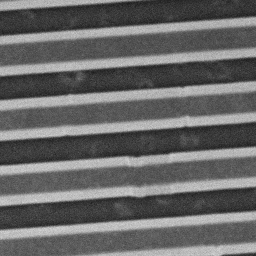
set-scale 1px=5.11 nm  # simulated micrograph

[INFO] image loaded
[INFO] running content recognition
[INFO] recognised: one or a few lines or trenches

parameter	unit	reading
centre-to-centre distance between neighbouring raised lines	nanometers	331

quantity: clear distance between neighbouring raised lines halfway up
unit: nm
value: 168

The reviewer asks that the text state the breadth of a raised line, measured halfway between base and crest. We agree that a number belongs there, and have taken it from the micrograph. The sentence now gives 164 nm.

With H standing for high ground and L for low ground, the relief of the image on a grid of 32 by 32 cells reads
HHHHLLLLLLLLLLLLLLLLLLLLLLLLLLLL
LLLLLLLLLLLLLLLLLLLLLLLLLLLLLLLL
LLLLLLLLLLLLLLLLLLLLLLLLLLLLLLLL
LLLLLLLLLLLLLLLLLLLLHHHHHHHHHHHH
LLLLLLLHHHHHHHHHHHHHHHHHHHHHHHHH
HHHHHHHHHHHHHHHHHHHHHHHHHHHHHHHH
HHHHHHHHHHHHHHHHHHHHHHHHHHHHHHHH
HHHHHHHHHHHHHHHHHHHLLLLLLLLLLLLL
HHHHHHLLLLLLLLLLLLLLLLLLLLLLLLLL
LLLLLLLLLLLLLLLLLLLLLLLLLLLLLLLL
LLLLLLLLLLLLLLLLLLLLLLLLLLLLLLLL
LLLLLLLLLLLLLLLLLLLLLLHHHHHHHHHH
LLLLLLLLHHHHHHHHHHHHHHHHHHHHHHHH
HHHHHHHHHHHHHHHHHHHHHHHHHHHHHHHH
HHHHHHHHHHHHHHHHHHHHHHHHHHHHHHHH
HHHHHHHHHHHHHHHHHHHHHLLLLLLLLLLL
HHHHHHHHLLLLLLLLLLLLLLLLLLLLLLLL
LLLLLLLLLLLLLLLLLLLLLLLLLLLLLLLL
LLLLLLLLLLLLLLLLLLLLLLLLLLLLLLLL
LLLLLLLLLLLLLLLLLLLLLLLLHHHHHHHH
LLLLLLLLLLHHHHHHHHHHHHHHHHHHHHHH
HHHHHHHHHHHHHHHHHHHHHHHHHHHHHHHH
HHHHHHHHHHHHHHHHHHHHHHHHHHHHHHHH
HHHHHHHHHHHHHHHHHHHHHHLLLLLLLLLL
HHHHHHHHLLLLLLLLLLLLLLLLLLLLLLLL
LLLLLLLLLLLLLLLLLLLLLLLLLLLLLLLL
LLLLLLLLLLLLLLLLLLLLLLLLLLLLLLLL
LLLLLLLLLLLLLLLLLLLLLLLLLHHHHHHH
LLLLLLLLLLLHHHHHHHHHHHHHHHHHHHHH
HHHHHHHHHHHHHHHHHHHHHHHHHHHHHHHH
HHHHHHHHHHHHHHHHHHHHHHHHHHHHHHHH
HHHHHHHHHHHHHHHHHHHHHHHHLLLLLLLL